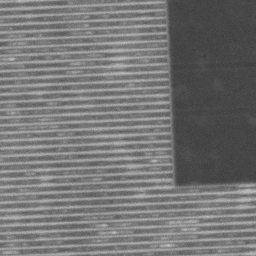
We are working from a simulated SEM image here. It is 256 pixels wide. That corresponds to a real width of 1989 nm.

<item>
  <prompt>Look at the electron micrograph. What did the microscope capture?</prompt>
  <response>parallel lines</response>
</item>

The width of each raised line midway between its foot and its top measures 14.6 nm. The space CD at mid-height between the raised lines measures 49.5 nm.